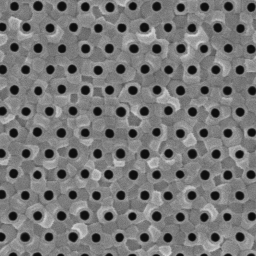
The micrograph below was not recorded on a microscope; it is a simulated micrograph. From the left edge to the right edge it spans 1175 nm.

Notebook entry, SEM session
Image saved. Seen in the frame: a regular array of holes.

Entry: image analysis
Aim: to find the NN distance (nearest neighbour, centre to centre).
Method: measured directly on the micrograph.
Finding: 0.106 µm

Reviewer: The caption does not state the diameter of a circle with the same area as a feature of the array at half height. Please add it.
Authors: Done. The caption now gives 39.7 nm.